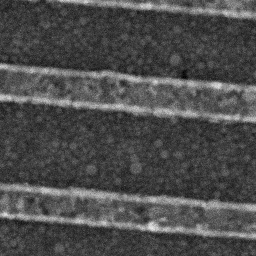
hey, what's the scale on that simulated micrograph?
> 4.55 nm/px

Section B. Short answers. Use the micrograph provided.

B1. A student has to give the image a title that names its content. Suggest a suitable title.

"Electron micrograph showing one or a few lines or trenches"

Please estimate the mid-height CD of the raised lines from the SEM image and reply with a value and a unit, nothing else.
134 nanometers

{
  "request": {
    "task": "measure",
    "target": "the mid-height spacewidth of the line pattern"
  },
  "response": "398 nanometers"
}